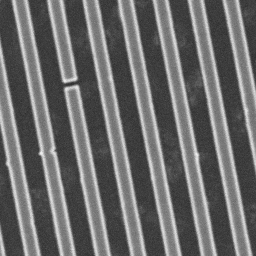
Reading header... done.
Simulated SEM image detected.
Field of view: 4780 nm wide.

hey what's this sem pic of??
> parallel lines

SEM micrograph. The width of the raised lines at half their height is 264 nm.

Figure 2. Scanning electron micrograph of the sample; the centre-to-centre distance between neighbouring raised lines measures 34.6 pixels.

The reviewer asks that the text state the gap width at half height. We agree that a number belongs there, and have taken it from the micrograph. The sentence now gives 390 nanometers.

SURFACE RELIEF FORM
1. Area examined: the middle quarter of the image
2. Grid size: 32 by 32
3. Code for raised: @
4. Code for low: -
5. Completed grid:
@@------@@@------@@@------@@@---
@@@-----@@@@-----@@@------@@@---
@@@-----@@@@-----@@@------@@@---
@@@-----@@@@-----@@@@-----@@@@--
---------@@@------@@@-----@@@@--
---------@@@------@@@-----@@@@--
@@@@-----@@@@-----@@@------@@@--
@@@@-----@@@@-----@@@------@@@--
-@@@-----@@@@-----@@@@-----@@@@-
-@@@------@@@------@@@-----@@@@-
-@@@------@@@------@@@-----@@@@-
-@@@@-----@@@------@@@------@@@-
-@@@@-----@@@@-----@@@------@@@-
--@@@-----@@@@-----@@@@-----@@@@
--@@@------@@@-----@@@@-----@@@@
--@@@------@@@------@@@-----@@@@
--@@@@-----@@@------@@@------@@@
--@@@@-----@@@@-----@@@------@@@
---@@@-----@@@@-----@@@@-----@@@
---@@@-----@@@@-----@@@@-----@@@
---@@@------@@@------@@@-----@@@
---@@@@-----@@@------@@@------@@
---@@@@-----@@@@-----@@@------@@
---@@@@-----@@@@-----@@@------@@
----@@@-----@@@@-----@@@@-----@@
----@@@------@@@------@@@-----@@
----@@@@-----@@@------@@@-----@@
----@@@@-----@@@------@@@------@
----@@@@-----@@@@-----@@@------@
----@@@@-----@@@@-----@@@@-----@
-----@@@------@@@-----@@@@-----@
-----@@@@-----@@@------@@@-----@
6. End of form